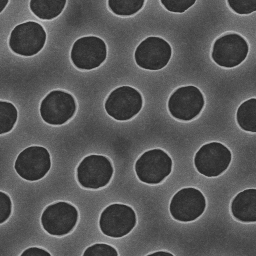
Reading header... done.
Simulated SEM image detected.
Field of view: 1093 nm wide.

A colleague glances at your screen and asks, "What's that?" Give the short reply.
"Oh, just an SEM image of a regular array of holes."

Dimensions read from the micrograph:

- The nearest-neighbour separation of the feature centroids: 0.246 microns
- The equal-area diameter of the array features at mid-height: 151 nm